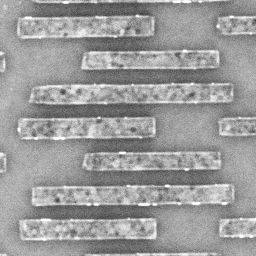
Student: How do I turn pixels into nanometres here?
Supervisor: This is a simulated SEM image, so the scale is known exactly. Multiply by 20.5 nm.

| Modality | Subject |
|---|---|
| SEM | wiring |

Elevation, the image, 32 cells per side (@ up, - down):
--------------------------------
--------------------------------
--@@@@@@@@@@@@@@@@@--------@@@@@
--@@@@@@@@@@@@@@@@@--------@@@@@
--@@@@@@@@@---------------------
--------------------------------
------------------@@@@@@@@@-----
----------@@@@@@@@@@@@@@@@@-----
-----------@@@------------------
--------------------------------
--------------------------------
----@@@@@@@@@@@@@@@@@@@@@@@@@---
----@@@@@@@@@@@@@@@@@@@@@@@@@---
--------------------------------
--------------------------------
--@@@@@@@@@@@@@@@@@--------@@@@@
--@@@@@@@@@@@@@@@@@---------@@@@
--------------------------------
--------------------------------
@----------@@@@@@@@@@@@@@@@-----
@---------@@@@@@@@@@@@@@@@@-----
--------------------------------
--------------------------------
----@@@@@@@@@@@@@@@@@@@@@@@@@---
----@@@@@@@@@@@@@@@@@@@@@@@@@---
----@@@-------------------------
--------------------------------
--------------@@@@@---------@@@@
---@@@@@@@@@@@@@@@@---------@@@@
---@@@@@@@@@@@@@@@@-------------
--------------------------------
--------------------------------